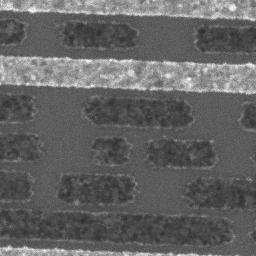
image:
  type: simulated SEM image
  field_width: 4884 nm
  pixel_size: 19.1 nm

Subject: parallel lines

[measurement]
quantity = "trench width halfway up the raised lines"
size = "166 nm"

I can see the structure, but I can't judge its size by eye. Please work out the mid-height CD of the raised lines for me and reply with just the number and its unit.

553 nm